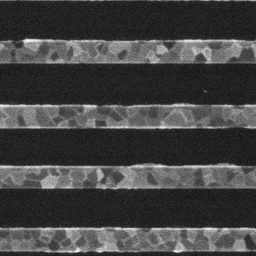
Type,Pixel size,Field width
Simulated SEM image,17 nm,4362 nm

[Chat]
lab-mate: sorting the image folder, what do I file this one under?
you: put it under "lines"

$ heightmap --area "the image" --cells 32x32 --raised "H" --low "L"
LLLLLLLLLLLLLLLLLLLLLLLLLLLLLLLL
LLLLLLLLLLLLLLLLLLLLLLLLLLLLLLLL
LLLLLLLLLLLLLLLLLLLLLLLLLLLLLLLL
LLLLLLLLLLLLLLLLLLLLLLLLLLLLLLLL
LLLLLLLLLLLLLLLLLLLLLLLLLLLLLLLL
HHHHHHHHHHHHHHHHHHHHHHHHHHHHHHHH
HHHHHHHHHHHHHHHHHHHHHHHHHHHHHHHH
HHHHHHHHHHHHHHHHHHHHHHHHHHHHHHHH
LLLLLLLLLLLLLLLLLLLLLLLLLLLLLLLL
LLLLLLLLLLLLLLLLLLLLLLLLLLLLLLLL
LLLLLLLLLLLLLLLLLLLLLLLLLLLLLLLL
LLLLLLLLLLLLLLLLLLLLLLLLLLLLLLLL
LLLLLLLLLLLLLLLLLLLLLLLLLLLLLLLL
HHHHHHHHHHHHHHHHHHHHHHHHHHHHHHHH
HHHHHHHHHHHHHHHHHHHHHHHHHHHHHHHH
HHHHHHHHHHHHHHHHHHHHHHHHHHHHHHHH
LLLLLLLLLLLLLLLLLLLLLLLLLLLLLLLL
LLLLLLLLLLLLLLLLLLLLLLLLLLLLLLLL
LLLLLLLLLLLLLLLLLLLLLLLLLLLLLLLL
LLLLLLLLLLLLLLLLLLLLLLLLLLLLLLLL
LLLLLLLLLLLLLLLLLLLLLLLLLLLLLLLL
HHHHHHHHHHHHHHHHHHHHHHHHHHHHHHHH
HHHHHHHHHHHHHHHHHHHHHHHHHHHHHHHH
LLLLLLLLLLLLLLHLLLLLLLLLLLLLLLLL
LLLLLLLLLLLLLLLLLLLLLLLLLLLLLLLL
LLLLLLLLLLLLLLLLLLLLLLLLLLLLLLLL
LLLLLLLLLLLLLLLLLLLLLLLLLLLLLLLL
LLLLLLLLLLLLLLLLLLLLLLLLLLLLLLLL
LLLLLLLLLLLLLLLLLLLLLLLLLLLLLLLL
HHHHHHHHHHHHHHHHHHHHHHHHHHHHHHHH
HHHHHHHHHHHHHHHHHHHHHHHHHHHHHHHH
LLLLLLLLLLLLLLLLLLLLLLLLLLLLLLLL